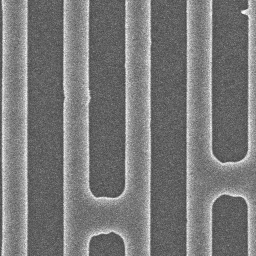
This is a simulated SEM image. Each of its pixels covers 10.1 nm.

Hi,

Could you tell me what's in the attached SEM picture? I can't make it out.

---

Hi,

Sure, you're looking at parallel lines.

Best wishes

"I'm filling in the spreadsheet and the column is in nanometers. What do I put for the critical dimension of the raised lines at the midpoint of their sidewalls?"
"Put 246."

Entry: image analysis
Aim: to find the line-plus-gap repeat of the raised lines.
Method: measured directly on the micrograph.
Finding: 624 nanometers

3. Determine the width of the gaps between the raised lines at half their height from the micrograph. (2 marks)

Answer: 377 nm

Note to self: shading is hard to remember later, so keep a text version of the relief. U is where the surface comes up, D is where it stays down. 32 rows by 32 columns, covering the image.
UUUDDDDDUUUDDDDDUUUDDDDUUUDDDDDU
UUUDDDDDUUUDDDDDUUUDDDDUUUDDDDDU
UUUDDDDDUUUDDDDDUUUDDDDUUUDDDDDU
UUUDDDDDUUUDDDDDUUUDDDDUUUDDDDDU
UUUDDDDDUUUDDDDDUUUDDDDUUUDDDDDU
UUUDDDDDUUUDDDDDUUUDDDDUUUDDDDDU
UUUDDDDDUUUDDDDDUUUDDDDUUUDDDDDU
UUUDDDDDUUUDDDDDUUUDDDDUUUDDDDDU
UUUDDDDDUUUDDDDDUUUDDDDUUUDDDDDU
UUUDDDDDUUUDDDDDUUUDDDDUUUDDDDDU
UUUDDDDDUUUDDDDDUUUDDDDUUUDDDDDU
UUUDDDDDUUUDDDDDUUUDDDDUUUDDDDDU
UUUDDDDDUUUDDDDDUUUDDDDUUUDDDDDU
UUUDDDDDUUUDDDDDUUUDDDDUUUDDDDDU
UUUDDDDDUUUDDDDDUUUDDDDUUUDDDDDU
UUUDDDDDUUUDDDDDUUUDDDDUUUDDDDDU
UUUDDDDDUUUDDDDDUUUDDDDUUUDDDDDU
UUUDDDDDUUUDDDDDUUUDDDDUUUDDDDDU
UUUDDDDDUUUDDDDDUUUDDDDUUUDDDDDU
UUUDDDDDUUUDDDDDUUUDDDDUUUUDDDDU
UUUDDDDDUUUDDDDDUUUDDDDUUUUUUUUU
UUUDDDDDUUUDDDDDUUUDDDDUUUUUUUUU
UUUDDDDDUUUDDDDDUUUDDDDUUUUUUUUU
UUUDDDDDUUUDDDDDUUUDDDDUUUUUUUUU
UUUDDDDDUUUUDDDUUUUDDDDUUUUDDDUU
UUUDDDDDUUUUUUUUUUUDDDDUUUUDDDDU
UUUDDDDDUUUUUUUUUUUDDDDUUUDDDDDU
UUUDDDDDUUUUUUUUUUUDDDDUUUDDDDDU
UUUDDDDDUUUUUUUUUUUDDDDUUUDDDDDU
UUUDDDDDUUUUDDDUUUUDDDDUUUDDDDDU
UUUDDDDDUUUDDDDDUUUDDDDUUUDDDDDU
UUUDDDDDUUUDDDDDUUUDDDDUUUDDDDDU